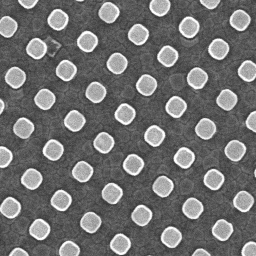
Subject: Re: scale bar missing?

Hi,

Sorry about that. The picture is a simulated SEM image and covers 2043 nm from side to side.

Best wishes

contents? a regular array of raised bodies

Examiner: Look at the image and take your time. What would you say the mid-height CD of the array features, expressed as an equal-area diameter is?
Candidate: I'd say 160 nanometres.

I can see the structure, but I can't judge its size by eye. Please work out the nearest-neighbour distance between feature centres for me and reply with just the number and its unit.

286 nm